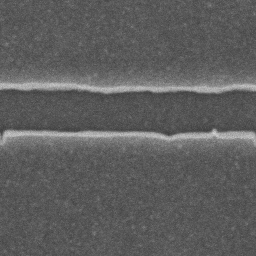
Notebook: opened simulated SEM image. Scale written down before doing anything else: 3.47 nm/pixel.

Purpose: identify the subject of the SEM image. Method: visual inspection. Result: one or a few lines or trenches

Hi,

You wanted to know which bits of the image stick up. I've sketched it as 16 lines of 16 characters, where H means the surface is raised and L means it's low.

HHHHHHHHHHHHHHHH
HHHHHHHHHHHHHHHH
HHHHHHHHHHHHHHHH
HHHHHHHHHHHHHHHH
HHHHHHHHHHHHHHHH
LLLLLHHHHHHHHHLL
LLLLLLLLLLLLLLLL
LLLLLLLLLLLLLLLL
HHHHHHHHHHLHHHHH
HHHHHHHHHHHHHHHH
HHHHHHHHHHHHHHHH
HHHHHHHHHHHHHHHH
HHHHHHHHHHHHHHHH
HHHHHHHHHHHHHHHH
HHHHHHHHHHHHHHHH
HHHHHHHHHHHHHHHH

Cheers